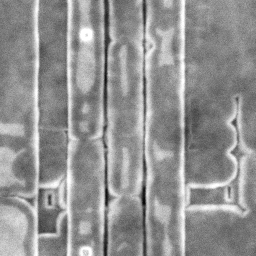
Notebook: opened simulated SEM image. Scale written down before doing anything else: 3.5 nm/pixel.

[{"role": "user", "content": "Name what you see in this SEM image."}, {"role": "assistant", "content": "wiring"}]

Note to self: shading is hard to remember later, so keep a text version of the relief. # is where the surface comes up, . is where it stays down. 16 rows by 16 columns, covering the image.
##..########....
##..#######.....
##..########....
##..#######.....
##..########....
##..########....
##..#######.....
##..#######.....
##..########....
##..########....
##..#######.....
##..#######.....
##..########....
##..########....
##..########....
##..########....